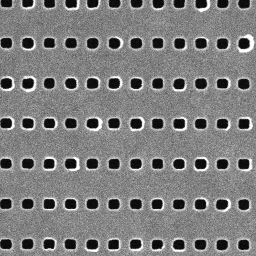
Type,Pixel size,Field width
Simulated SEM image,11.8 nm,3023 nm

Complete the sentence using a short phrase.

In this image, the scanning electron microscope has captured a regular array of holes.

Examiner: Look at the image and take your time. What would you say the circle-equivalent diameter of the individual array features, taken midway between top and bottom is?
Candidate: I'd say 137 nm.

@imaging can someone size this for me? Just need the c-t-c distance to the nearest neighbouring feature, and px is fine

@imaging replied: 21.5